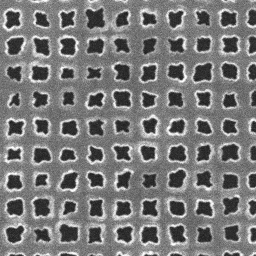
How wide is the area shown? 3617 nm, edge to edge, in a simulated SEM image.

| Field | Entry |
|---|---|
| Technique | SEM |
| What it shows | a regular array of holes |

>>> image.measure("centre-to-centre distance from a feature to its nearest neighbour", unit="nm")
365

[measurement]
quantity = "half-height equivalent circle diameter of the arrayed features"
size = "227 nm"